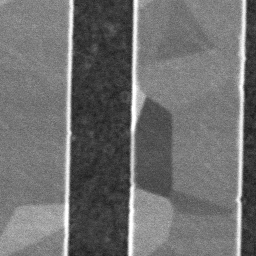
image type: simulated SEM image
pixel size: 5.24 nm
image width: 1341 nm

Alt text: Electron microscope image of one or a few lines or trenches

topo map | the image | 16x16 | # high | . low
####....#######.
####....#######.
####....#######.
####....#######.
####....#######.
####....#######.
####....#######.
####....#######.
####....#######.
####....#######.
####....#######.
####....#######.
####....#######.
####....#######.
####....#######.
####....#######.